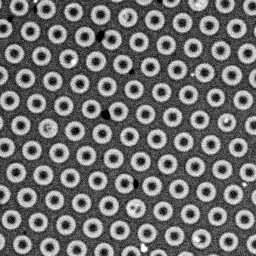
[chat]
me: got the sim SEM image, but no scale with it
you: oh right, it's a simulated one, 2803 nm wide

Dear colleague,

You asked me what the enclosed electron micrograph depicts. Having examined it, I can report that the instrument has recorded an array of small figures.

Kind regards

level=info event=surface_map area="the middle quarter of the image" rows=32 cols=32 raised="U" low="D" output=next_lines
UUUDDDUUUUDDDUUUUDDUUUUUDDUUUUDD
DDDDDDDUUDDDDUUUDDDUUUUUDDUUUUUD
DDDDDDDDDDDDDDDDDDDDUUUDDDUUUUDD
DDUUUUDDDDUDDDDDDDDDDDDDDDDUUDDD
DDUUUUDDDUUUUDDDUUUDDDDDDDDDDDDD
DDUUUUDDDUUUUDDDUUUUDDDUUUDDDDDD
DDUUUDDDDUUUUDDUUUUUDDUUUUUDDUUU
DDDDDDDDDUUUDDDDUUUDDDUUUUUDDUUU
UDDDDDDDDDDDDDDDDUDDDDDUUUDDDUUU
UUDDDDUUDDDDDDDDDDDDDDDDDDDDDDUU
UUDDDUUUUDDDUUUDDDDUUDDDDDDDDDDD
UUDDDUUUUDDUUUUUDDUUUUDDDDUUDDDD
UDDDDUUUUDDUUUUUDDUUUUUDDUUUUDDD
DDDDDDDDDDDDUUUDDDUUUUDDDUUUUDDD
DDDDDDDDDDDDDDDDDDDUUUDDDUUUUDDD
DUUUUDDDUUUDDDDDDDDDDDDDDDDUDDDD
DUUUUDDDUUUUDDDUUUDDDDDDDDDDDDDD
DUUUUDDUUUUUDDUUUUUDDUUUUDDDDUUD
DUUUDDDDUUUUDDUUUUDDDUUUUDDDUUUU
DDDDDDDDDUUDDDDUUUDDDUUUUDDDUUUU
DDDDDDDDDDDDDDDDDDDDDDUUUDDDUUUU
UDDDUUUDDDDUUDDDDDDDDDDDDDDDDUUD
UDDUUUUUDDUUUUDDDDUUUDDDDDDDDDDD
UDDUUUUUDDUUUUUDDUUUUDDDUUUUDDDD
DDDDUUUDDDUUUUUDDUUUUDDDUUUUDDDU
DDDDDDDDDDDUUUDDDUUUUDDDUUUUDDDU
DUUDDDDDDDDDDDDDDDUUDDDDUUUUDDDU
UUUUDDDUUUDDDDDDDDDDDDDDDDDDDDDU
UUUUDDUUUUUDDUUUUDDDDUUDDDDDDDDD
UUUUDDUUUUUDDUUUUDDDUUUUDDDUUUDD
UUUDDDDUUUDDDUUUUDDDUUUUDDDUUUUD
DDDDDDDDDDDDDDUUUDDDUUUUDDUUUUUD